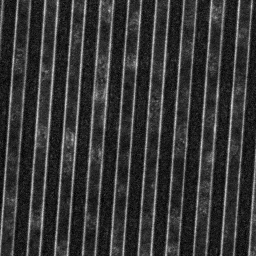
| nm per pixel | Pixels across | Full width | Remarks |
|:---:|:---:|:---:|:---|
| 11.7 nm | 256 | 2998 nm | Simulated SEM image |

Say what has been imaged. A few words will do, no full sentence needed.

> parallel lines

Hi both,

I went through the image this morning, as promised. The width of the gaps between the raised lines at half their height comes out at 171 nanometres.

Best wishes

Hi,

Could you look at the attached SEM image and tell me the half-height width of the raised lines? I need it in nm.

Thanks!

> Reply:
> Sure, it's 149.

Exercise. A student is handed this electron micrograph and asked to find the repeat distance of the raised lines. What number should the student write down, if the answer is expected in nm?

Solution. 324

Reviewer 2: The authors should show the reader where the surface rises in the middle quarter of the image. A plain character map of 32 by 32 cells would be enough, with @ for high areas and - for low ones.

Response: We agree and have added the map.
-@@@----@@@----@@@----@@@----@@@
-@@@----@@@----@@@----@@@----@@@
-@@@----@@@----@@@----@@@----@@@
-@@@----@@@----@@@----@@@----@@@
-@@@----@@@----@@@----@@@---@@@@
-@@@----@@@----@@@----@@@---@@@@
-@@@----@@@----@@@----@@@---@@@@
-@@@----@@@----@@@---@@@----@@@-
-@@@----@@@----@@@---@@@----@@@-
@@@@---@@@-----@@----@@@----@@@-
@@@@---@@@----@@@----@@@----@@@-
@@@----@@@----@@@----@@@----@@@-
@@@----@@@----@@@----@@@----@@@-
@@@----@@@----@@@----@@@----@@@-
@@@----@@@----@@@----@@@----@@@-
@@@----@@@----@@@----@@@----@@@-
@@@----@@@----@@@----@@@----@@@-
@@@----@@@----@@@----@@@----@@@-
@@@----@@@----@@@----@@@---@@@@-
@@@----@@@----@@@----@@@---@@@@-
@@@----@@@----@@@----@@@---@@@@-
@@@----@@@----@@@---@@@----@@@--
@@@----@@@---@@@@---@@@----@@@--
@@@---@@@----@@@----@@@----@@@--
@@@---@@@----@@@----@@@----@@@--
@@----@@@----@@@----@@@----@@@--
@@----@@@----@@@----@@@----@@@--
@@----@@@----@@@----@@@----@@@--
@@----@@@----@@@----@@@----@@@--
@@----@@@----@@@----@@@----@@@--
@@----@@@----@@@----@@@----@@@--
@@----@@@----@@@----@@@----@@@--